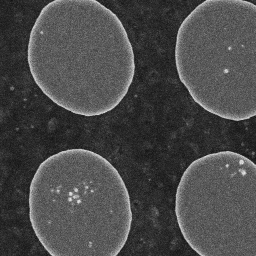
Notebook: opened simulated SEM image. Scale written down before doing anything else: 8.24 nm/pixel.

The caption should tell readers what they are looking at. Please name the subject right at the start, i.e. raised bodies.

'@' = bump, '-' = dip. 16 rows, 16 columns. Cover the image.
---@@@@-----@@@@
--@@@@@@---@@@@@
--@@@@@@---@@@@@
--@@@@@@---@@@@@
--@@@@@@---@@@@@
---@@@@@----@@@@
----@@@-----@@@@
----------------
----------------
----@@----------
--@@@@@-----@@@@
--@@@@@@---@@@@@
--@@@@@@---@@@@@
--@@@@@@---@@@@@
--@@@@@@---@@@@@
---@@@@@----@@@@